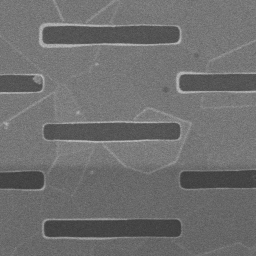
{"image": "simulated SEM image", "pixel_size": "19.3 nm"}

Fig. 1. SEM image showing groups of lines, slits or small figures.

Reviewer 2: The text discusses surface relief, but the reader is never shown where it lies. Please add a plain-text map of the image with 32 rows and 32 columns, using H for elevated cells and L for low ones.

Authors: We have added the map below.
HHHHHHHHHHHHHHHHHHHHHHHHHHHHHHHH
HHHHHHHHHHHHHHHHHHHHHHHHHHHHHHHH
HHHHHHHHHHHHHHHHHHHHHHHHHHHHHHHH
HHHHHLLLLLLLLLLLLLLLLLHHHHHHHHHH
HHHHHLLLLLLLLLLLLLLLLLLHHHHHHHHH
HHHHHLLLLLLLLLLLLLLLLLHHHHHHHHHH
HHHHHHHHHHHHHHHHHHHHHHHHHHHHHHHH
HHHHHHHHHHHHHHHHHHHHHHHHHHHHHHHH
HHHHHHHHHHHHHHHHHHHHHHHHHHHHHHHH
LLLLLHHHHHHHHHHHHHHHHHLLLLLLLLLL
LLLLLHHHHHHHHHHHHHHHHHLLLLLLLLLL
LLLLLHHHHHHHHHHHHHHHHHHLLLHHHLLH
HHHHHHHHHHHHHHHHHHHHHHHHHHHHHHHH
HHHHHHHHHHHHHHHHHHHHHHHHHHHHHHHH
HHHHHHHHHHHHHHHHHHHHHHHHHHHHHHHH
HHHHHHLLLLLLLLLLLLLLLLHHHHHHHHHH
HHHHHLLLLLLLLLLLLLLLLLLHHHHHHHHH
HHHHHHLLLLLLLLLLLLLLLLHHHHHHHHHH
HHHHHHHHHHHHHHHHHHHHHHHHHHHHHHHH
HHHHHHHHHHHHHHHHHHHHHHHHHHHHHHHH
HHHHHHHHHHHHHHHHHHHHHHHHHHHHHHHH
LLLLLHHHHHHHHHHHHHHHHHHLLLLLLLLL
LLLLLLHHHHHHHHHHHHHHHHLLLLLLLLLL
LLLLLHHHHHHHHHHHHHHHHHHLLLLLLLLL
HHHHHHHHHHHHHHHHHHHHHHHHHHHHHHHH
HHHHHHHHHHHHHHHHHHHHHHHHHHHHHHHH
HHHHHHHHHHHHHHHHHHHHHHHHHHHHHHHH
HHHHHHLLLLLLLLLLLLLLLLHHHHHHHHHH
HHHHHLLLLLLLLLLLLLLLLLLHHHHHHHHH
HHHHHHLLLLLLLLLLLLLLLLHHHHHHHHHH
HHHHHHHHHHHHHHHHHHHHHHHHHHHHHHHH
HHHHHHHHHHHHHHHHHHHHHHHHHHHHHHHH